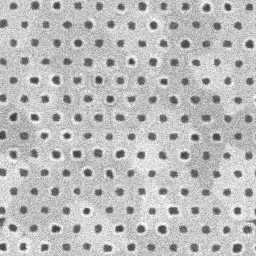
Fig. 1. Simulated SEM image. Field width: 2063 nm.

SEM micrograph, a regular array of holes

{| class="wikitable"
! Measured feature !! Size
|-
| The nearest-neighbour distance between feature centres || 167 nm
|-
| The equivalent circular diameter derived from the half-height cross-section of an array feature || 69.3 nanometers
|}